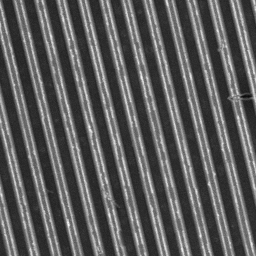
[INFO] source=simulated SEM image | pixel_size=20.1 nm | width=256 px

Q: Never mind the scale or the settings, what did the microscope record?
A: parallel lines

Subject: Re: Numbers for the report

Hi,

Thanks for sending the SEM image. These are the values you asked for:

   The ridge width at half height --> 0.176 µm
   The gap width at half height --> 0.247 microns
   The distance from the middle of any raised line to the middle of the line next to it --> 0.424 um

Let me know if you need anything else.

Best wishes